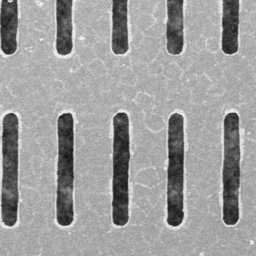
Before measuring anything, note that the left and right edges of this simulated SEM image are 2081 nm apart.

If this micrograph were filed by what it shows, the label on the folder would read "holes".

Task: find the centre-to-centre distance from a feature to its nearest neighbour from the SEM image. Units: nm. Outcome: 448